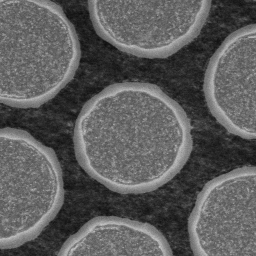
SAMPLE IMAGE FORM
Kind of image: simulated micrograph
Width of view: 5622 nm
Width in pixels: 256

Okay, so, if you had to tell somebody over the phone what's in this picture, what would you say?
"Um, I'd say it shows raised bodies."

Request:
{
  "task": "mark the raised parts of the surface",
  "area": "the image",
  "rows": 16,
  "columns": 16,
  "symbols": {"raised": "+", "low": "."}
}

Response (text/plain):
+++...+++++++...
++++..++++++....
+++++..++++...++
+++++.........++
++++.........+++
++++...++....+++
......+++++..+++
.....++++++...++
+....+++++++....
+++..+++++++....
++++..+++++.....
++++...+++...+++
++++.........+++
+++.........++++
++...+++++..++++
....++++++..++++